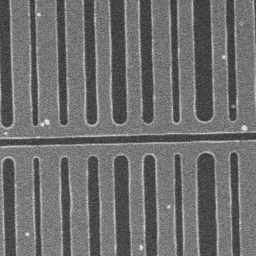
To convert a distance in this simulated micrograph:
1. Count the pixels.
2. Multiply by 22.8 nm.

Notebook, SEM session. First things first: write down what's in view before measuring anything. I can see groups of lines, slits or small figures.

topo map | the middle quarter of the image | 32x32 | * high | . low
.****...****....***...*****..***
.****...****....***...*****..***
.****...****....***...*****..***
.****...****....***...*****..***
.****...****....***....****..***
.****...****....***....****..***
.****...****....***....****..***
.****...****....***....****..***
.****...****....***....****..***
.****...****....***....****..***
.****....***....***....****..***
.****....***....***....****..***
.****....***....***....****..***
.****....***....***....****..***
.*****..*****..*****..*****..***
********************************
********************************
************************........
................................
................................
********************************
********************************
****************************.***
.*****..*****...****...****..***
.*****...***....****...****..***
.*****...***....****...****..***
.*****...***....****...****..***
.*****...***....****...****...**
.*****...***....****...****...**
.*****...***....****...****...**
..****...***....****...****...**
..****...***....****...****...**